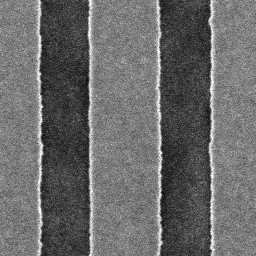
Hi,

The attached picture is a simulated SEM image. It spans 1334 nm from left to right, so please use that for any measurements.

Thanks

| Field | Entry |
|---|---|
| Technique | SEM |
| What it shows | one or a few lines or trenches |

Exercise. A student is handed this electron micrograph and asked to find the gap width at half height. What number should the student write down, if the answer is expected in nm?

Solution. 264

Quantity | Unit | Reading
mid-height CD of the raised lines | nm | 366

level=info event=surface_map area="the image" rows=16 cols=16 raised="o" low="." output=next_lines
oo....oooo...ooo
oo....oooo...ooo
oo....oooo...ooo
oo....oooo...ooo
oo....oooo...ooo
oo....oooo...ooo
ooo...oooo...ooo
ooo...oooo...ooo
ooo...oooo...ooo
ooo...oooo...ooo
ooo...oooo...ooo
ooo...oooo...ooo
ooo...oooo...ooo
ooo...oooo...ooo
ooo...oooo...ooo
ooo...oooo...ooo